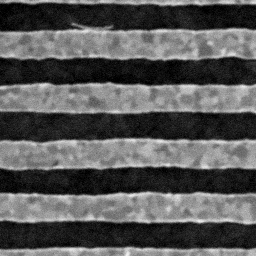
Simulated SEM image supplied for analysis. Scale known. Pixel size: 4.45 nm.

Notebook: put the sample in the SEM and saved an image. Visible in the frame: lines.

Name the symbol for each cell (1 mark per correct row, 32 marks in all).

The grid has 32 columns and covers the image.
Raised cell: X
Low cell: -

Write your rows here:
----------------XX-XXXXXXXX--XX-
--------------------------------
--------------------------------
--------------------------------
XXXXXXXXXXXXXXXXXXXXXXXXXXXXXXXX
XXXXXXXXXXXXXXXXXXXXXXXXXXXXXXXX
XXXXXXXXXXXXXXXXXXXXXXXXXXXXXXXX
--------------------------------
--------------------------------
--------------------------------
----XX----XXXX------------------
XXXXXXXXXXXXXXXXXXXXXXXXXXXXXXXX
XXXXXXXXXXXXXXXXXXXXXXXXXXXXXXXX
XXXXXXXXXXXXXXXXXXXXXXXXXXXXXXXX
--------------------------------
--------------------------------
--------------------------------
--------------XXXXX-------------
XXXXXXXXXXXXXXXXXXXXXXXXXXXXXXXX
XXXXXXXXXXXXXXXXXXXXXXXXXXXXXXXX
XXXXXXXXXXXXXXXXXXXXXXXXXXXXXXXX
--------------------------------
--------------------------------
--------------------------------
XXXXXXXXXXXXXXXXXXXXXXXXXXXXXXXX
XXXXXXXXXXXXXXXXXXXXXXXXXXXXXXXX
XXXXXXXXXXXXXXXXXXXXXXXXXXXXXXXX
XXXXXXXXXXXXXXXXXXXXXXXXXXXXXXXX
--------------------------------
--------------------------------
--------------------------------
XXXXXXXXXXXXXXXXXXXXXXXXXXXXXXXX